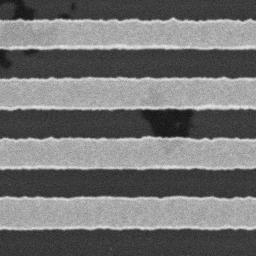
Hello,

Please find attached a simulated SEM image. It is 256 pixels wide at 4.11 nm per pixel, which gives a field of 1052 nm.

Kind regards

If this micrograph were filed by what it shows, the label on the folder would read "lines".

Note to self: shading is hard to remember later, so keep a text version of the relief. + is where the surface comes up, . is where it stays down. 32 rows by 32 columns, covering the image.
................................
................................
..+.++.++++++.+.+..+.+....+++..+
++++++++++++++++++++++++++++++++
++++++++++++++++++++++++++++++++
++++++++++++++++++++++++++++++++
................................
................................
................................
................................
++++++++++++++++++++++++++++++++
++++++++++++++++++++++++++++++++
++++++++++++++++++++++++++++++++
++++++++++++++++++++++++++++++++
................................
................................
................................
++++++++++++++++++++++++++++++++
++++++++++++++++++++++++++++++++
++++++++++++++++++++++++++++++++
++++++++++++++++++++++++++++++++
................................
................................
................................
................................
++++++++++++++++++++++++++++++++
++++++++++++++++++++++++++++++++
++++++++++++++++++++++++++++++++
++++++++++++++++++++.++.++++++++
................................
................................
................................